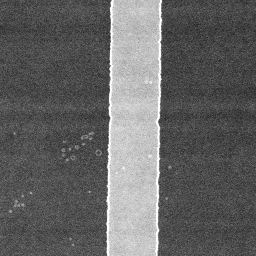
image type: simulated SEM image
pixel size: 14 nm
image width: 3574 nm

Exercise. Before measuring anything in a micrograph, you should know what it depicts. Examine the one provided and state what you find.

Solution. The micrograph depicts one or a few lines or trenches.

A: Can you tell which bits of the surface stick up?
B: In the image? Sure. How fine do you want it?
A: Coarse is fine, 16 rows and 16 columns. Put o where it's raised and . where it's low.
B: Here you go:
ooooooo...oooooo
ooooooo...oooooo
ooooooo...oooooo
ooooooo...oooooo
ooooooo...oooooo
ooooooo...oooooo
ooooooo...oooooo
ooooooo...oooooo
ooooooo...oooooo
ooooooo...oooooo
ooooooo...oooooo
ooooooo...oooooo
ooooooo...oooooo
ooooooo...oooooo
ooooooo...oooooo
ooooooo...oooooo